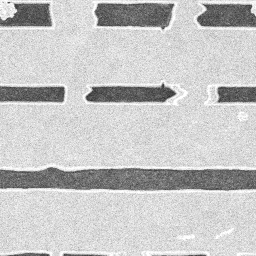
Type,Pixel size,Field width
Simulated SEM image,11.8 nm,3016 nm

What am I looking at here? one or a few lines or trenches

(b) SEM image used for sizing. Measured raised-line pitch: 966 nm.